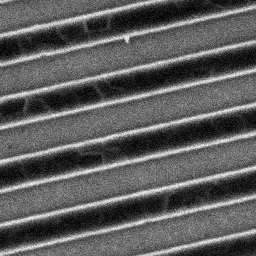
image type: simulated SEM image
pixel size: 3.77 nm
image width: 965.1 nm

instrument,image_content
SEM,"parallel lines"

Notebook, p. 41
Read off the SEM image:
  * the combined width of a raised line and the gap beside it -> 232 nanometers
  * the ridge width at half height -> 112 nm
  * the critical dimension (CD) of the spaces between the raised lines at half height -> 121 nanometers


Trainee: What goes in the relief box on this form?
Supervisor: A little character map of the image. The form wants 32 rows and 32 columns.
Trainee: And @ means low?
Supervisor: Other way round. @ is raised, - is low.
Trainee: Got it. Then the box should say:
-----------------@@@@@@@@@@@@@@@
-------------@@@@@@@@@@@@@@@@@--
--------@@@@@@@@@@@@@@@@@-------
----@@@@@@@@@@@@@@@@@-----------
@@@@@@@@@@@@@@@@----------------
@@@@@@@@@@@@------------------@@
@@@@@@@-------------------@@@@@@
@@@------------------@@@@@@@@@@@
-----------------@@@@@@@@@@@@@@@
-------------@@@@@@@@@@@@@@@@---
--------@@@@@@@@@@@@@@@@--------
----@@@@@@@@@@@@@@@@------------
@@@@@@@@@@@@@@@@----------------
@@@@@@@@@@@------------------@@@
@@@@@@@------------------@@@@@@@
@@@------------------@@@@@@@@@@@
----------------@@@@@@@@@@@@@@@@
------------@@@@@@@@@@@@@@@@@---
-------@@@@@@@@@@@@@@@@@--------
---@@@@@@@@@@@@@@@@@------------
@@@@@@@@@@@@@@@-----------------
@@@@@@@@@@@------------------@@@
@@@@@@-------------------@@@@@@@
@@------------------@@@@@@@@@@@@
----------------@@@@@@@@@@@@@@@@
-----------@@@@@@@@@@@@@@@@@----
-------@@@@@@@@@@@@@@@@@--------
---@@@@@@@@@@@@@@@@-------------
@@@@@@@@@@@@@@@-----------------
@@@@@@@@@@-------------------@@@
@@@@@@------------------@@@@@@@@
@@------------------@@@@@@@@@@@@